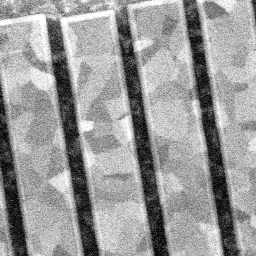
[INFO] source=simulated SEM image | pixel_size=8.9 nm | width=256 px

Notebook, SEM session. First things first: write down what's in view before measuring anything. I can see one or a few lines or trenches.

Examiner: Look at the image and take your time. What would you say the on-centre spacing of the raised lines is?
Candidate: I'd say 610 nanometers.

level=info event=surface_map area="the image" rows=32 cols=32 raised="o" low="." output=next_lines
..................ooooo..oooooo.
................ooooooo..oooooo.
..ooo....ooooo...oooooo..ooooooo
ooooo...oooooo...oooooo..ooooooo
oooooo..oooooo...oooooo...oooooo
oooooo..ooooooo..oooooo...oooooo
oooooo...oooooo..oooooo...oooooo
oooooo...oooooo..ooooooo..oooooo
oooooo...oooooo...oooooo..oooooo
oooooo...oooooo...oooooo..oooooo
ooooooo..oooooo...oooooo...ooooo
.oooooo..ooooooo..oooooo...ooooo
.oooooo...oooooo..oooooo...ooooo
.oooooo...oooooo..ooooooo..ooooo
.oooooo...oooooo...oooooo..ooooo
.oooooo...oooooo...oooooo..ooooo
.ooooooo..oooooo...oooooo...oooo
..oooooo..ooooooo..oooooo...oooo
..oooooo...oooooo..oooooo...oooo
..oooooo...oooooo..ooooooo..oooo
..oooooo...oooooo...oooooo..oooo
..oooooo...oooooo...oooooo..oooo
..ooooooo..oooooo...oooooo...ooo
..ooooooo..ooooooo..oooooo...ooo
...oooooo...oooooo..oooooo...ooo
...oooooo...oooooo..ooooooo..ooo
o..oooooo...oooooo...oooooo..ooo
o..oooooo...oooooo...oooooo..ooo
o..ooooooo..oooooo...oooooo...oo
o..ooooooo..oooooo...oooooo...oo
o...oooooo..ooooooo..oooooo...oo
o...oooooo...oooooo..ooooooo..oo